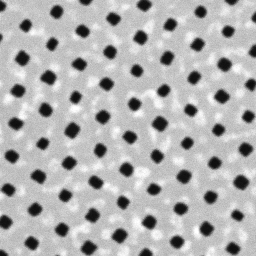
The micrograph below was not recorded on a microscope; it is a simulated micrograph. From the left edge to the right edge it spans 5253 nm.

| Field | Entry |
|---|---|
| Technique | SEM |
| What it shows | a regular array of holes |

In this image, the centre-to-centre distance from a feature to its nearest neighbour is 0.67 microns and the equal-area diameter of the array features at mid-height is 291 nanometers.